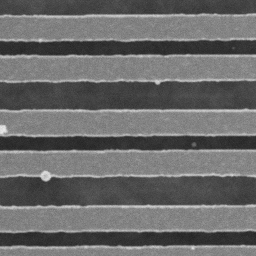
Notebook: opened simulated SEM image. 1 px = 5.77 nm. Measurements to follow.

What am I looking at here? lines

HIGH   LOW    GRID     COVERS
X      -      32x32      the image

--------------------------------
--------------------------------
XXXXXXXXXXXXXXXXXXXXXXXXXXXXXXXX
XXXXXXXXXXXXXXXXXXXXXXXXXXXXXXXX
XXXXXXXXXXXXXXXXXXXXXXXXXXXXXXXX
--------------------------------
--------------------------------
XXXXXXXXXXXXXXXXXXXXXXXXXXXXXXXX
XXXXXXXXXXXXXXXXXXXXXXXXXXXXXXXX
XXXXXXXXXXXXXXXXXXXXXXXXXXXXXXXX
--------------------------------
--------------------------------
--------------------------------
--------------------------------
XXXXXXXXXXXXXXXXXXXXXXXXXXXXXXXX
XXXXXXXXXXXXXXXXXXXXXXXXXXXXXXXX
XXXXXXXXXXXXXXXXXXXXXXXXXXXXXXXX
--------------------------------
--------------------------------
XXXXXXXXXXXXXXXXXXXXXXXXXXXXXXXX
XXXXXXXXXXXXXXXXXXXXXXXXXXXXXXXX
XXXXXXXXXXXXXXXXXXXXXXXXXXXXXXXX
--------------------------------
--------------------------------
--------------------------------
--------------------------------
XXXXXXXXXXXXXXXXXXXXXXXXXXXXXXXX
XXXXXXXXXXXXXXXXXXXXXXXXXXXXXXXX
XXXXXXXXXXXXXXXXXXXXXXXXXXXXXXXX
--------------------------------
--------------------------------
XXXXXXXXXXXXXXXXXXXXXXXXXXXXXXXX